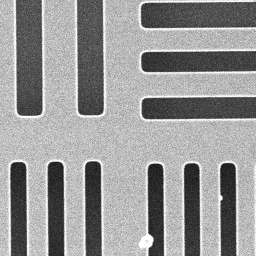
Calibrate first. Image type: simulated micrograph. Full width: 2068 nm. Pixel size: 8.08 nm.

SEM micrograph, groups of lines, slits or small figures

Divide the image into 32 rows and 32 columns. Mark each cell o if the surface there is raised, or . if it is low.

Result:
oo...ooooo...ooooo..............
oo...ooooo...ooooo..............
oo...ooooo...ooooo..............
oo...ooooo...ooooo..............
oo...ooooo...ooooooooooooooooooo
oo...ooooo...ooooooooooooooooooo
oo...ooooo...ooooo..............
oo...ooooo...ooooo..............
oo...ooooo...ooooo..............
oo...ooooo...ooooooooooooooooooo
oo...ooooo...ooooooooooooooooooo
oo...ooooo...ooooooooooooooooooo
oo...ooooo...ooooo..............
oo...ooooo...ooooo..............
ooo..oooooo.oooooo..............
oooooooooooooooooooooooooooooooo
oooooooooooooooooooooooooooooooo
oooooooooooooooooooooooooooooooo
oooooooooooooooooooooooooooooooo
oooooooooooooooooooooooooooooooo
oo.ooo..ooo.ooooooo.ooo.oooo.ooo
o..ooo..ooo..ooooo...oo..oo..ooo
o..ooo..ooo..ooooo...oo..oo...oo
o..ooo..ooo..ooooo...oo..oo...oo
o..ooo..ooo..ooooo...oo..ooo..oo
o..ooo..ooo..ooooo...oo..oo...oo
o..ooo..ooo..ooooo...oo..oo...oo
o..ooo..ooo..ooooo...oo..oo...oo
o..ooo..ooo..ooooo...oo..oo...oo
o..ooo..ooo..oooooo..oo..oo...oo
o...oo..ooo..oooooo..oo..oo...oo
o...oo..ooo..ooooo...oo..oo...oo